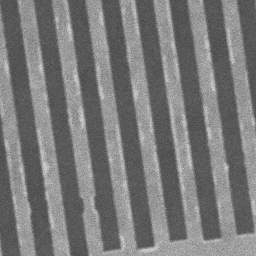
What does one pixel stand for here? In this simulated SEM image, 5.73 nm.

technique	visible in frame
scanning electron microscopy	parallel lines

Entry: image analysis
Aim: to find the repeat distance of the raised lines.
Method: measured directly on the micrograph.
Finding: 0.192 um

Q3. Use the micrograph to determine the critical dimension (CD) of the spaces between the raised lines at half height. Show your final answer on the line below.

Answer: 110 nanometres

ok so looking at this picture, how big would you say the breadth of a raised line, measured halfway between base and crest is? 0.0808 µm